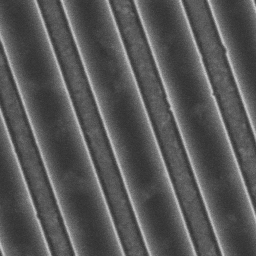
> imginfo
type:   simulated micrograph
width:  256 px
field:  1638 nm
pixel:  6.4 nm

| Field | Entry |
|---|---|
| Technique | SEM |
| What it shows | one or a few lines or trenches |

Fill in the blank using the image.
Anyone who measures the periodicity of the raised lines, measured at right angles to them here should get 440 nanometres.